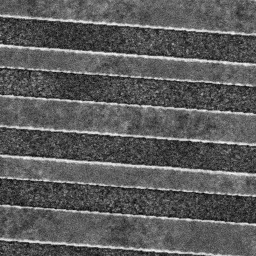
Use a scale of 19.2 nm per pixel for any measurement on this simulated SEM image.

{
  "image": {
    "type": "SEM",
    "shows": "lines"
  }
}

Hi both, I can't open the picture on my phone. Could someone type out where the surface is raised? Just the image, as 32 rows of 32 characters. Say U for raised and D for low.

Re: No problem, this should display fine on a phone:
UUUUUUUUUUUUUUUUUUUUUUUUUUUUUUUU
UUUUUUUUUUUUUUUUUUUUUUUUUUUUUUUU
DDDDDDUUUUUUUUUUUUUUUUUUUUUUUUUU
DDDDDDDDDDDDDDDDDDDDUUUUUUUUUUUU
DDDDDDDDDDDDDDDDDDDDDDDDDDDDDDDD
DDDDDDDDDDDDDDDDDDDDDDDDDDDDDDDD
UUUUUUUUUUUUDDDDDDDDDDDDDDDDDDDD
UUUUUUUUUUUUUUUUUUUUUUUUDDDDDDDD
DDUUUUUUUUUUUUUUUUUUUUUUUUUUUUUU
DDDDDDDDDDDDDDDUUUUUUUUUUUUUUUUU
DDDDDDDDDDDDDDDDDDDDDDDDDDDDDUUU
DDDDDDDDDDDDDDDDDDDDDDDDDDDDDDDD
UUUUUUUUDDDDDDDDDDDDDDDDDDDDDDDD
UUUUUUUUUUUUUUUUUUUUUUDDDDDDDDDD
UUUUUUUUUUUUUUUUUUUUUUUUUUUUUUUU
UUUUUUUUUUUUUUUUUUUUUUUUUUUUUUUU
DDDDDDDDDDUUUUUUUUUUUUUUUUUUUUUU
DDDDDDDDDDDDDDDDDDDDDDUUUUUUUUUU
DDDDDDDDDDDDDDDDDDDDDDDDDDDDDDDD
UDDDDDDDDDDDDDDDDDDDDDDDDDDDDDDD
UUUUUUUUUUUUUUUDDDDDDDDDDDDDDDDD
UUUUUUUUUUUUUUUUUUUUUUUUUUUDDDDD
DDDUUUUUUUUUUUUUUUUUUUUUUUUUUUUU
DDDDDDDDDDDDDDDDDDUUUUUUUUUUUUUU
DDDDDDDDDDDDDDDDDDDDDDDDDDDDDDDU
DDDDDDDDDDDDDDDDDDDDDDDDDDDDDDDD
UUUUUUUUUUUDDDDDDDDDDDDDDDDDDDDD
UUUUUUUUUUUUUUUUUUUUUUUUDDDDDDDD
UUUUUUUUUUUUUUUUUUUUUUUUUUUUUUUU
UUUUUUUUUUUUUUUUUUUUUUUUUUUUUUUU
DDDDDDDDUUUUUUUUUUUUUUUUUUUUUUUU
DDDDDDDDDDDDDDDDDDDDDUUUUUUUUUUU